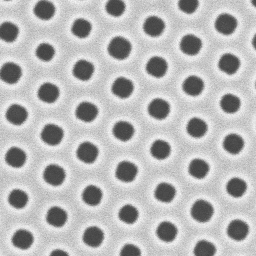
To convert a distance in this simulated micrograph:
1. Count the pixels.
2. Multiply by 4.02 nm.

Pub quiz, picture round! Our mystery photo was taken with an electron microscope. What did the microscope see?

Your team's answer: a regular array of holes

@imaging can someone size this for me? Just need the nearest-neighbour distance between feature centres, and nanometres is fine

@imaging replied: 163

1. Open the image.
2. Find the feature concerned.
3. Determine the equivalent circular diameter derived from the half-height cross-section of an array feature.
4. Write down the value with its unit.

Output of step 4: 82.6 nm